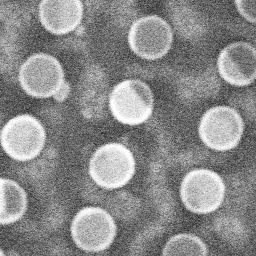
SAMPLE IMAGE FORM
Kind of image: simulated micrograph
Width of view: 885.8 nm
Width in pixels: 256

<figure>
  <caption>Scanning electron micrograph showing a regular array of raised bodies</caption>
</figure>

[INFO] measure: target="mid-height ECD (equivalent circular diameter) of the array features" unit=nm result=148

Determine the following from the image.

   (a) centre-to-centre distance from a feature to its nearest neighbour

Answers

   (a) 229 nm